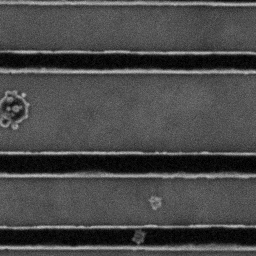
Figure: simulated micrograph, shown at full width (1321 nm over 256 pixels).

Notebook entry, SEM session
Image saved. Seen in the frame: lines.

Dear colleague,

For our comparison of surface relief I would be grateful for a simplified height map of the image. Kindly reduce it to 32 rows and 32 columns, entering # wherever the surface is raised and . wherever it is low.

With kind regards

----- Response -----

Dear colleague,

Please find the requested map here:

..........................######
................................
................................
................................
................................
................................
######.####..###................
################################
################################
................................
................................
................................
.#..............................
###.............................
###.............................
................................
................................
................................
................................
################################
################################
################################
................................
................................
................................
................................
................................
................................
################################
################################
################################
................................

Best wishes